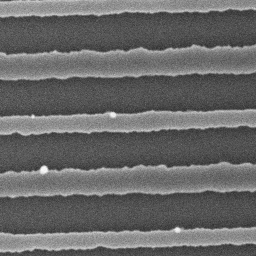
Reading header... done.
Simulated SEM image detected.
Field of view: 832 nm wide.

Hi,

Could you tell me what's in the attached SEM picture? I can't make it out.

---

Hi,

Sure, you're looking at lines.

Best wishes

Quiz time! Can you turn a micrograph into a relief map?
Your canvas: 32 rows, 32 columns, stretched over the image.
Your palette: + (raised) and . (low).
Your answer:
++++++++++++++++++++++++++++++++
+++++++++++++++...++.+..........
................................
................................
................................
................................
......+...++.+++++++++++++++++++
++++++++++++++++++++++++++++++++
++++++++++++++++++++++++++++++++
++++++++++++++++++...+..........
................................
................................
................................
................................
.......+.+++++++++++++++++++++++
++++++++++++++++++++++++++++++++
++++++++++++...+................
................................
................................
................................
...........................++.+.
.+.+++++++++++++++++++++++++++++
++++++++++++++++++++++++++++++++
++++++++++++++++++++++++++++++++
++++............................
................................
................................
................................
..............................++
++++++++++++++++++++++++++++++++
++++++++++++++++++++++++++++.+..
................................